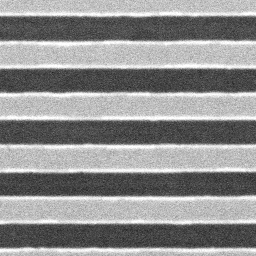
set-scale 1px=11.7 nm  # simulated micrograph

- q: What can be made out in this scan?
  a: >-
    lines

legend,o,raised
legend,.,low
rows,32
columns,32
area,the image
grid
oooooooooooooooooooooooooooooooo
oooooooooooooooooooooooooooooooo
................................
................................
................................
oooooooooooooooooooooooooooooooo
oooooooooooooooooooooooooooooooo
oooooooooooooooooooooooooooooooo
................................
................................
................................
................................
oooooooooooooooooooooooooooooooo
oooooooooooooooooooooooooooooooo
oooooooooooooooooooooooooooooooo
................................
................................
................................
oooooooooooooooooooooooooooooooo
oooooooooooooooooooooooooooooooo
oooooooooooooooooooooooooooooooo
................................
................................
................................
................................
oooooooooooooooooooooooooooooooo
oooooooooooooooooooooooooooooooo
oooooooooooooooooooooooooooooooo
................................
................................
................................
oooooooooooooooooooooooooooooooo